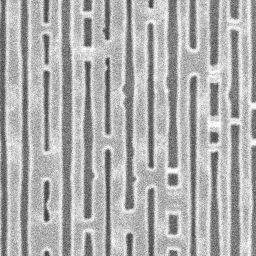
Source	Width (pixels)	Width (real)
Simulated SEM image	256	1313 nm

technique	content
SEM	parallel lines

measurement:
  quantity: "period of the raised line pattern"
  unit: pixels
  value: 21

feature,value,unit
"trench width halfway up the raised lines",0.0423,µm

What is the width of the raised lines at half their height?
0.0654 micrometres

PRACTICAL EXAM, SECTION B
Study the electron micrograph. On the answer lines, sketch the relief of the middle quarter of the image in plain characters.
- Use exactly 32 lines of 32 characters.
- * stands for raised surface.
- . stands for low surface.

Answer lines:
..***..****.***...***..***...***
..***..***..***...***..***...***
..***..***..***...***..***...***
..***..***..***...***..**....***
..***..***..***...***..**....**.
..***..***..***...***..***...**.
..***..***..**....***..***...**.
..***..***..***...***..***...**.
..***..***..***...***..***...**.
..***..***..***...***..***..***.
..***..***..***...***..***..***.
..***..***..***...***..***..***.
..***..***..***...***..***..***.
..***..***..***...***..***..***.
..***..***..***...***..***..***.
..***..***..***...***..***..***.
..**...***..***...***..***...**.
..***..***..***...***..***...**.
..***..********..****..***...**.
..***..********..****..***...**.
..***..********..****..***...**.
..***..***..***...***..***...**.
..***..***..***...***..***...**.
..***..***..***...***..***...**.
..***..***..***...***..***...**.
..***..***..***...***..***...**.
..***..***..***...*************.
..***...**..***...********...**.
..***...**..***...********...**.
..***..***..***...********...**.
..***..***..***...********...**.
..***..***..***...***..*********